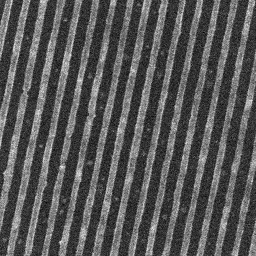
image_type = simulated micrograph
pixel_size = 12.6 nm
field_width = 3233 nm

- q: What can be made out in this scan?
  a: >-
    parallel lines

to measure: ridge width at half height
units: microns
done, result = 0.0681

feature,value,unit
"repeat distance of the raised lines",214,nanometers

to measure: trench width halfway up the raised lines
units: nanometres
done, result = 145